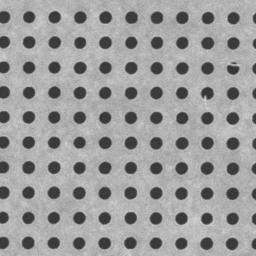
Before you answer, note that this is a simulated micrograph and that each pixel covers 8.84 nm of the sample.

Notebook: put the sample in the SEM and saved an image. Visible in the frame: a regular array of holes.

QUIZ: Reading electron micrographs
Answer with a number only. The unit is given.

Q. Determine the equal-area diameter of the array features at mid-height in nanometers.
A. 112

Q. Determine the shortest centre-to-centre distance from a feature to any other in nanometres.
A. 219